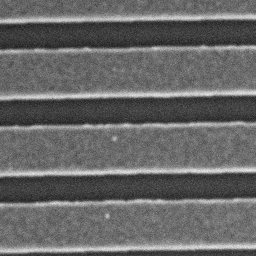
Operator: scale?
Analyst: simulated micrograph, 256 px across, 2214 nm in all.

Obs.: lines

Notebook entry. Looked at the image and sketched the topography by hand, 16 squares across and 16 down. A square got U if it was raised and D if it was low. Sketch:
UUUUUUUUUUUUUUUU
DDDDDDDDDDDDDDDD
DDDDDDDDDDDDDDDD
UUUUUUUUUUUUUUUU
UUUUUUUUUUUUUUUU
UUUUUUUUUUUUUUUU
DDDDDDDDDDDDDDDD
DDDDDDDDDDDDDDDD
UUUUUUUUUUUUUUUU
UUUUUUUUUUUUUUUU
UUUUUUUUUUUUUUUU
DDDDDDDDDDDDDDDD
DDDDDDDDDDDDDDUU
UUUUUUUUUUUUUUUU
UUUUUUUUUUUUUUUU
UUUUUUUUUUDDDDDD